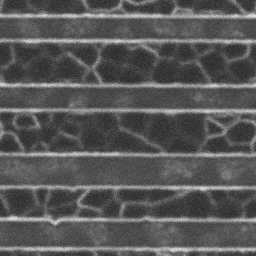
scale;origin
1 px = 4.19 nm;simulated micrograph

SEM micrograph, one or a few lines or trenches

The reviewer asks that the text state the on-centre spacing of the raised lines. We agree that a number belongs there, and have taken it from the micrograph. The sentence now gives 294 nm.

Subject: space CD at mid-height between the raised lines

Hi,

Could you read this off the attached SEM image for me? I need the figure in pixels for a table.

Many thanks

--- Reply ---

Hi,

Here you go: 24.2